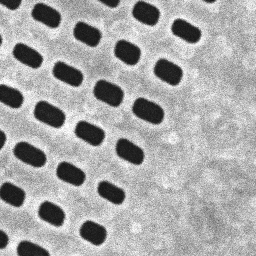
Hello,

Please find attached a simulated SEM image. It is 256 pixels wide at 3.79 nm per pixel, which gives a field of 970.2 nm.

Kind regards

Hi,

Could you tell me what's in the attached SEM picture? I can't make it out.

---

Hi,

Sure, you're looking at a regular array of holes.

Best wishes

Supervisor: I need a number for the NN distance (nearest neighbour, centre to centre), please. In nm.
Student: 167